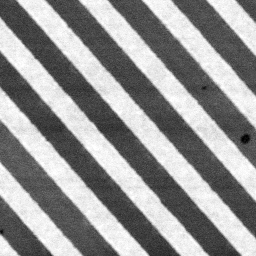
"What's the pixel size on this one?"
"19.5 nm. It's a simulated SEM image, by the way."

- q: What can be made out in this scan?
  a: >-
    lines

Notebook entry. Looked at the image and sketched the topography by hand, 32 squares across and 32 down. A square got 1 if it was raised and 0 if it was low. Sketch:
00011100001111000011110000111100
00011110000111100001111000011110
00001111000011110000111100001111
10000111100001111000011110000111
11000011110000111000001110000011
11100001111000011100000111000001
11110000111000001110000011100000
01111000011100000111000011110000
00111100001110000111100001111000
00011100001111000011110000111100
00001110000111100001111000011110
10000111000011110000111100001111
10000111100001111000011100000111
11000011110000111100001110000011
11100001111000011100000111000001
01110000111100001110000011100000
01111000011110000111000011110000
00111100001110000011100001111000
00011110000111000011110000111100
00001111000011100001111000011110
00000111100011110000111100001110
10000011100001111000011110000111
11000001110000111100001111000011
11100000111000011110000111000001
11110000111100001111000011100001
01111000011110000111000001110000
00111100001111000011100001111000
00011100000111100001110000111100
00001110000011110000111000011110
00000111000001110000111100001111
10000111100000111000011110000111
11000011110000011100001111000011